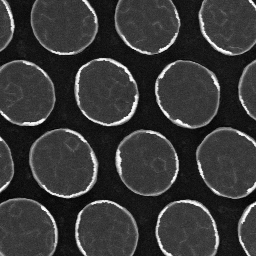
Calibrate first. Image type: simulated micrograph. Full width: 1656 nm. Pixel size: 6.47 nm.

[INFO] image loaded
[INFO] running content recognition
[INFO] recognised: raised bodies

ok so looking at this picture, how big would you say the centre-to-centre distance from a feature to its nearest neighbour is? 522 nm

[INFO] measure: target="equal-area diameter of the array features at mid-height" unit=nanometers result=427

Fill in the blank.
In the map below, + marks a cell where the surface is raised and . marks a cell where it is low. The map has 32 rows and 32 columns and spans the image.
+...+++++++....+++++++...+++++++
+...++++++++..++++++++...+++++++
++..++++++++..++++++++...+++++++
++..++++++++...+++++++...+++++++
++..++++++++...+++++++...+++++++
+....++++++.....+++++.....++++++
.......+++........++........+++.
............++..................
+++++.....++++++.....+++++.....+
++++++....++++++....+++++++...++
+++++++..++++++++..++++++++...++
+++++++..++++++++..++++++++...++
+++++++...+++++++...+++++++...++
+++++++...+++++++...+++++++...++
++++++.....++++++....++++++....+
..+++.......+++.......++++......
......+++........++.......++++..
.....++++++....++++++....+++++++
+...+++++++....+++++++...+++++++
+...++++++++..++++++++...+++++++
++..++++++++..++++++++...+++++++
++..++++++++...+++++++...+++++++
+....+++++++...+++++++...+++++++
+....++++++.....+++++.....++++++
.......+++..................+++.
+++++......++++......++++......+
++++++....++++++....++++++.....+
+++++++...+++++++...+++++++...++
+++++++..++++++++...+++++++...++
+++++++...+++++++...+++++++...++
+++++++...+++++++...+++++++...++
+++++++...+++++++...+++++++....+